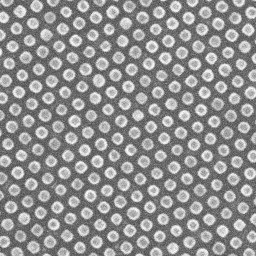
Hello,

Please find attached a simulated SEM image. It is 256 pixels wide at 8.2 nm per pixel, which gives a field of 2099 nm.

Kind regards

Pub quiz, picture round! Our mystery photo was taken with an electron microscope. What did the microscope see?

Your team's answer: a regular array of raised bodies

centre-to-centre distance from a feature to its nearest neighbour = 142 nm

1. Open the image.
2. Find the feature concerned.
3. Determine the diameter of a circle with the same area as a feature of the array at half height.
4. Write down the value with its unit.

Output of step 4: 0.0865 microns